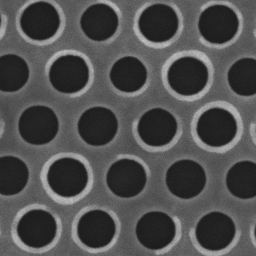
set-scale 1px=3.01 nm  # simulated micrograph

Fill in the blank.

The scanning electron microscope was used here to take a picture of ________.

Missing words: a regular array of holes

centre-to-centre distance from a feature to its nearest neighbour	178	nm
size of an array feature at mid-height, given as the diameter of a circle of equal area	119	nanometers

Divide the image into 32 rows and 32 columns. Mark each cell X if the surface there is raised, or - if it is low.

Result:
XXXX--XXXXXX-XXXXXXXXXXXXXXXXXXX
XXX----XXX----XXXX----XXX----XXX
XXX----XXX-----XX-----XXX-----XX
XXX----XXX-----XX-----XXX-----XX
XXX----XXXX---XXXX----XXX----XXX
XXXXXXXXXXXXXXXXXXXXXXXXXXX-XXXX
XXXXXXXXXXXXXXXXXXXXXXXXXXXXXXXX
---XXXX---XXXXX--XXXXX---XXXXX--
----XX-----XXX----XXX-----XXX---
----XX-----XXX----XXX-----XX----
---XXX-----XXX----XXX-----XXX---
X-XXXXX---XXXXX--XXXXX---XXXX---
XXXXXXXXXXXXXXXXXXXXXXXXXXXXXXXX
XXX---XXXXX--XXXXXXXXXXXXXXXXXXX
XXX----XXX----XXXX----XXX----XXX
XX-----XXX-----XX-----XXX-----XX
XX-----XXX-----XX-----XXX-----XX
XXX----XXXX---XXXX---XXXX----XXX
XXXXXXXXXXXXXXXXXXXXXXXXXXXXXXXX
XXXXXXXXXXXXXXXXXXXXXXXXXXXXXXXX
---XXXX---XXXX----XXXX---XXXX---
----XX-----XX-----XXX-----XX----
---XXX-----XX-----XXX-----XX----
---XXX-----XXX----XXX----XXX----
XXXXXXXX-XXXXXX--XXXXX--XXXXX---
XXXXXXXXXXXXXXXXXXXXXXXXXXXXXXXX
XXX---XXXXX--XXXXXX-XXXXXX--XXXX
XXX----XXX----XXX-----XXX----XXX
XX-----XXX----XXX-----XXX----XXX
XX-----XXX----XXX-----XXX----XXX
XXX---XXXXX---XXXX---XXXX----XXX
XXXXXXXXXXXXXXXXXXXXXXXXXXXXXXXX